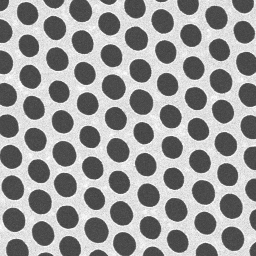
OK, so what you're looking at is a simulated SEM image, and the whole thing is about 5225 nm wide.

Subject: a regular array of holes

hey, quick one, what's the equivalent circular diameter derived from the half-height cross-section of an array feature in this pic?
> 471 nm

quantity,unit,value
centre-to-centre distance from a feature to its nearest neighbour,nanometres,620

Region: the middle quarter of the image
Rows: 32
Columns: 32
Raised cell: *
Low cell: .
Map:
.**....****...**......********..
**......********......********..
***.....********......**...***..
***.....**....***.....*.....***.
****...**......***...**.....****
.********......********......***
.*********.....***..****....***.
.***...***.....**.....**....**..
.**.....***...**......********..
***......*******......********..
***......********.....***...***.
****....***....**.....**.....***
.****..***.....****..***.....***
..********......********......**
..********......***.****.....**.
..***..****....***....***....**.
..**....****..***.....*********.
****.....********......********.
****.....***.*****....***...****
.***.....**....****...**.....***
..***...***.....********......**
...********.....********......**
...********.....***..****....***
...***..***.....**....****..***.
...**....****..***.....********.
..**......********.....********.
*****.....********.....***...***
..***.....**....***...***.....**
...***...**.....*********.....**
...********......********.....**
...********......**...****....**
...***...***....**......***.****